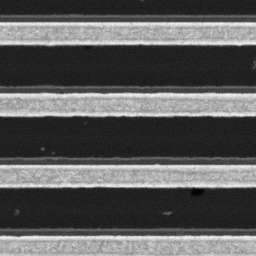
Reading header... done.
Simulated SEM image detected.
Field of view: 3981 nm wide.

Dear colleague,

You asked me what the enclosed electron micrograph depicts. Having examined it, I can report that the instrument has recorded lines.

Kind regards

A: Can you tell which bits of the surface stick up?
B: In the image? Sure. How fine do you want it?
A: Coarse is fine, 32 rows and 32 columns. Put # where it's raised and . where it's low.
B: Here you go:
................................
................................
################################
################################
################################
################################
................................
................................
................................
................................
................................
################################
################################
################################
................................
................................
................................
................................
................................
................................
################################
################################
################################
................................
................................
................................
................................
................................
................................
################################
################################
################################